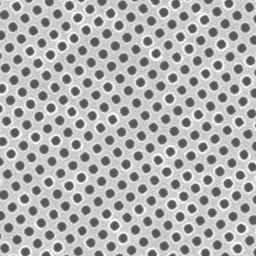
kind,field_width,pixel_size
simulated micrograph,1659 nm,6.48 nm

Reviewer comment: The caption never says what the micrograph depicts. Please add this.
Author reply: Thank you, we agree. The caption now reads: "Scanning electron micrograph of a regular array of holes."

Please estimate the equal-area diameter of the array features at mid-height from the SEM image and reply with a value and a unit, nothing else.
63.7 nanometers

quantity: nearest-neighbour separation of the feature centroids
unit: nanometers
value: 94.1